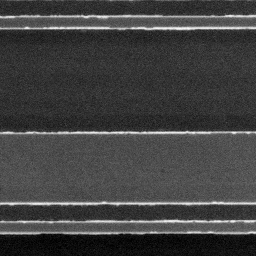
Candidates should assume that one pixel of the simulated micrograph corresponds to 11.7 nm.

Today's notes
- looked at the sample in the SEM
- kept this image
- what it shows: lines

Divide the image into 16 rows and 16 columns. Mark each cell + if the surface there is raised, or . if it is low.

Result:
++++++++++++++++
++++++++++++++++
................
................
................
................
................
................
++++++++++++++++
++++++++++++++++
++++++++++++++++
++++++++++++++++
++++++++++++++++
++++++++++++++++
++++++++++++++++
................